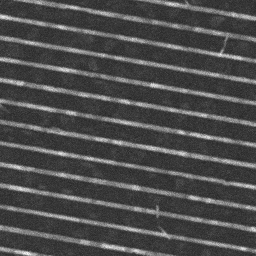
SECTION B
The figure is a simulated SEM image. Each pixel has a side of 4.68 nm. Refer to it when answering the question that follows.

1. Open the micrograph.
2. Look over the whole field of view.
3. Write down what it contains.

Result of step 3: parallel lines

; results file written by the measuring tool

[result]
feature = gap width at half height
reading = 81.9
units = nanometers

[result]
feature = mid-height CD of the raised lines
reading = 0.0173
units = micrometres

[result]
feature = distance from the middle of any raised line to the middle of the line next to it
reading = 97.4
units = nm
